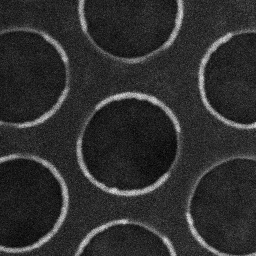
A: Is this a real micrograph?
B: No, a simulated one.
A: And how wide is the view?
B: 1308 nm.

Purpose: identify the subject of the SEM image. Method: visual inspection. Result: holes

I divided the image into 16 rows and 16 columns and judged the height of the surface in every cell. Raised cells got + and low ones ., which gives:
+++++......+++++
+++++......+++++
...+++....++++..
....+++..++++...
....+++++++++...
....+++++++++...
...++++...+++...
..++++.....+++..
+++++......+++++
+++++......+++++
...++......++...
....++....++....
....++++++++....
....++++++++....
...+++....++....
+++++.....+++...